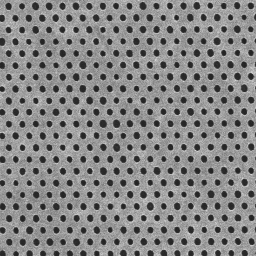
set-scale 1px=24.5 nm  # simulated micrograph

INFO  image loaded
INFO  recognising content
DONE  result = a regular array of holes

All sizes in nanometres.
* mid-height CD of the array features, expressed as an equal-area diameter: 162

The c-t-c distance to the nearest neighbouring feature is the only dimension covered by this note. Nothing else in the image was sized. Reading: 325 nm